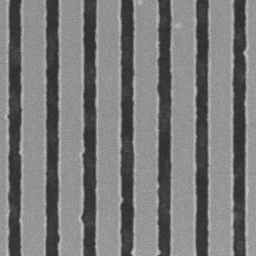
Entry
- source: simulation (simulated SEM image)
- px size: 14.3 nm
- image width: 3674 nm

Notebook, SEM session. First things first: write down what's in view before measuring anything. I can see parallel lines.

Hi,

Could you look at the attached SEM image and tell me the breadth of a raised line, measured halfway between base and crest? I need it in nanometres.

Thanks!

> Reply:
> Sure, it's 337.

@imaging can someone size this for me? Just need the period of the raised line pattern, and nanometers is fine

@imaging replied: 537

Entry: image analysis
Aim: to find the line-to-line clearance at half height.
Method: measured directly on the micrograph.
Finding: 197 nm